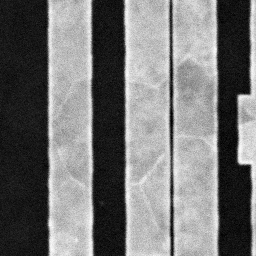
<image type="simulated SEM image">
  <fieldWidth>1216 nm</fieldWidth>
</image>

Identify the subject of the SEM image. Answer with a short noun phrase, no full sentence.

wiring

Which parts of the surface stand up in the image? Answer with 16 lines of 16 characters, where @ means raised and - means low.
---@@@--@@@@@---
---@@@--@@@@@---
---@@@--@@@@@---
---@@@--@@@@@---
---@@@--@@@@@@--
---@@@--@@@@@@--
---@@@--@@@@@@-@
---@@@--@@@@@@-@
---@@@--@@@@@@-@
---@@@--@@@@@@-@
---@@@--@@@@@@--
---@@@--@@@@@@--
---@@@--@@@@@@--
---@@@--@@@@@@--
---@@@--@@@@@@--
---@@@--@@@@@@--